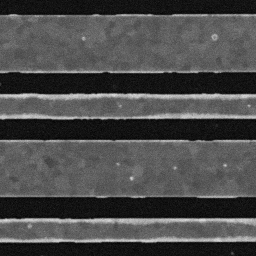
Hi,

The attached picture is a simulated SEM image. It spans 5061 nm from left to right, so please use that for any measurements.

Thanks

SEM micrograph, lines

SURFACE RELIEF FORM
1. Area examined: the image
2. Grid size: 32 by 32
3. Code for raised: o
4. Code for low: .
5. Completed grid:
................................
................................
oooooooooooooooooooooooooooooooo
oooooooooooooooooooooooooooooooo
oooooooooooooooooooooooooooooooo
oooooooooooooooooooooooooooooooo
oooooooooooooooooooooooooooooooo
oooooooooooooooooooooooooooooooo
oooooooooooooooooooooooooooooooo
................................
................................
................................
oooooooooooooooooooooooooooooooo
oooooooooooooooooooooooooooooooo
oooooooooooooooooooooooooooooooo
................................
................................
................................
oooooooooooooooooooooooooooooooo
oooooooooooooooooooooooooooooooo
oooooooooooooooooooooooooooooooo
oooooooooooooooooooooooooooooooo
oooooooooooooooooooooooooooooooo
oooooooooooooooooooooooooooooooo
oooooooooooooooooooooooooooooooo
................................
................................
...oooo..............ooooooooo..
oooooooooooooooooooooooooooooooo
oooooooooooooooooooooooooooooooo
................................
................................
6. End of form